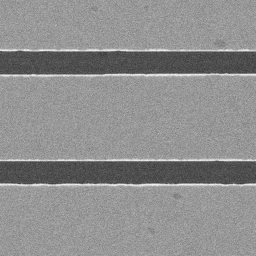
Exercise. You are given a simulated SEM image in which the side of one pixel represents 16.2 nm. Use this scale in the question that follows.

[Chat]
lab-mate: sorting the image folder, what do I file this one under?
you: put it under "lines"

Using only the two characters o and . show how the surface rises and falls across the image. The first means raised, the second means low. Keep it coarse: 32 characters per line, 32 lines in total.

oooooooooooooooooooooooooooooooo
oooooooooooooooooooooooooooooooo
oooooooooooooooooooooooooooooooo
oooooooooooooooooooooooooooooooo
oooooooooooooooooooooooooooooooo
oooooooooooooooooooooooooooooooo
................................
................................
................................
oooooooooooooooooooooooooooooooo
oooooooooooooooooooooooooooooooo
oooooooooooooooooooooooooooooooo
oooooooooooooooooooooooooooooooo
oooooooooooooooooooooooooooooooo
oooooooooooooooooooooooooooooooo
oooooooooooooooooooooooooooooooo
oooooooooooooooooooooooooooooooo
oooooooooooooooooooooooooooooooo
oooooooooooooooooooooooooooooooo
oooooooooooooooooooooooooooooooo
................................
................................
................................
oooooooooooooooooooooooooooooooo
oooooooooooooooooooooooooooooooo
oooooooooooooooooooooooooooooooo
oooooooooooooooooooooooooooooooo
oooooooooooooooooooooooooooooooo
oooooooooooooooooooooooooooooooo
oooooooooooooooooooooooooooooooo
oooooooooooooooooooooooooooooooo
oooooooooooooooooooooooooooooooo